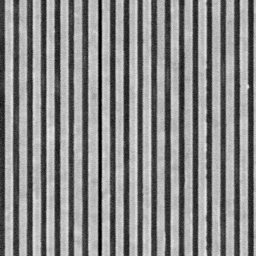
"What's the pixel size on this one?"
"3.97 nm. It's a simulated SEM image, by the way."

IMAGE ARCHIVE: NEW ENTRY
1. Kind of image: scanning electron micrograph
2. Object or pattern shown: parallel lines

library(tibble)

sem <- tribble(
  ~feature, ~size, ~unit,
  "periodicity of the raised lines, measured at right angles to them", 54.8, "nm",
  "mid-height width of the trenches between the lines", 25.3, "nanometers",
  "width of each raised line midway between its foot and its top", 28.8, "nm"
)